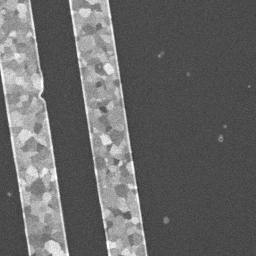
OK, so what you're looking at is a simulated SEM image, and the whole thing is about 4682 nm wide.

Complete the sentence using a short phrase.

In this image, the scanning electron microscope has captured one or a few lines or trenches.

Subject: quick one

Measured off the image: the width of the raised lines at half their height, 682 nm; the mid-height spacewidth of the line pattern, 0.734 µm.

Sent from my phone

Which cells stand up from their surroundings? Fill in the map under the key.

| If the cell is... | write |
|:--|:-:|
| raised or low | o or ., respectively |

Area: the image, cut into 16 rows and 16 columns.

oo..ooo.........
oo...oo.........
oo...oo.........
oo...oo.........
ooo..oo.........
ooo..ooo........
ooo..ooo........
.oo...oo........
.oo...oo........
.oo...oo........
.oo...oo........
.ooo..oo........
.ooo..ooo.......
..oo..ooo.......
..oo...oo.......
..oo...oo.......